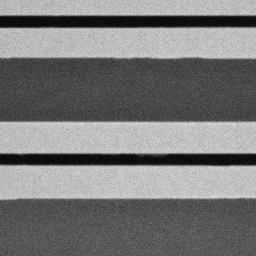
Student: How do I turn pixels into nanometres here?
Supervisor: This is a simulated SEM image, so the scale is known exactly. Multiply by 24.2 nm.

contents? lines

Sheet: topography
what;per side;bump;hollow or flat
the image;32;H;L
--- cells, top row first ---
HHHHHHHHHHHHHHHHHHHHHHHHHHHHHHHH
HHHHHHHHHHHHHHHHHHHHHHHHHHHHHHHH
LLLLLLLLLLLLLLLLLLLLLLLLLLLLLLLL
LLLLLLLLLLLLLLLLLLLLLLLHHHHHHHHH
HHHHHHHHHHHHHHHHHHHHHHHHHHHHHHHH
HHHHHHHHHHHHHHHHHHHHHHHHHHHHHHHH
HHHHHHHHHHHHHHHHHHHHHHHHHHHHHHHH
LLLLLLLLLLLLLLLLLLLLLLLLLLLLLLLL
LLLLLLLLLLLLLLLLLLLLLLLLLLLLLLLL
LLLLLLLLLLLLLLLLLLLLLLLLLLLLLLLL
LLLLLLLLLLLLLLLLLLLLLLLLLLLLLLLL
LLLLLLLLLLLLLLLLLLLLLLLLLLLLLLLL
LLLLLLLLLLLLLLLLLLLLLLLLLLLLLLLL
LLLLLLLLLLLLLLLLLLLLLLLLLLLLLLLL
LLLLLLLLLLLLLLLLLLLLLLLLLLLLLLLL
HHHHHHHHHHHHHHHHHHHHHHHHHHHHHHHH
HHHHHHHHHHHHHHHHHHHHHHHHHHHHHHHH
HHHHHHHHHHHHHHHHHHHHHHHHHHHHHHHH
HHHHHHHHHHHHHHHHHHHHHHHHHHHHHHHH
LLLLLLLLLLLLLLLLLLLLLLLLLLLLLLLL
LLLLLLLLLLLLLLLLLLLLLLLLLLLLLLLL
HHHHHHHHHHHHHHHHHHHHHHHHHHHHHHHH
HHHHHHHHHHHHHHHHHHHHHHHHHHHHHHHH
HHHHHHHHHHHHHHHHHHHHHHHHHHHHHHHH
HHHHHHHHHHHHHHHHHHHHHHHHHHHHHHHH
LLLLLLLLLLLLLLLLLLLLLLLLLLLLLLLL
LLLLLLLLLLLLLLLLLLLLLLLLLLLLLLLL
LLLLLLLLLLLLLLLLLLLLLLLLLLLLLLLL
LLLLLLLLLLLLLLLLLLLLLLLLLLLLLLLL
LLLLLLLLLLLLLLLLLLLLLLLLLLLLLLLL
LLLLLLLLLLLLLLLLLLLLLLLLLLLLLLLL
LLLLLLLLLLLLLLLLLLLLLLLLLLLLLLLL